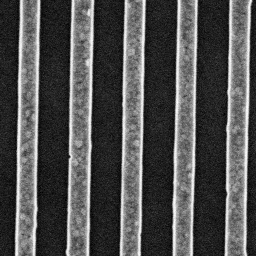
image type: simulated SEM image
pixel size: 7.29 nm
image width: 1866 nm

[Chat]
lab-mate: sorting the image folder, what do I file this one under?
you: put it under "parallel lines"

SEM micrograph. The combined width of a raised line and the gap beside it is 382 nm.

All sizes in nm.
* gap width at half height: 241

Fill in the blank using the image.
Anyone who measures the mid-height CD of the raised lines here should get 140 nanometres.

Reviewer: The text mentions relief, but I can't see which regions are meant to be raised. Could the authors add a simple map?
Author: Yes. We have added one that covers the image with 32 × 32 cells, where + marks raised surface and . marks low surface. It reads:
...++....+++....++....+++....++.
...++....+++....++....+++....++.
...++....+++....++....+++....++.
...++....+++....++....+++....++.
...++....+++....++....+++....++.
...++....++.....++....++.....++.
..+++....++.....++....++.....++.
..+++....++.....++....++.....++.
..+++....++.....++....++.....++.
..+++....++.....++....++.....++.
..+++....++.....++....++.....++.
..+++....++.....++....++.....++.
..+++....++....+++....++.....++.
..+++....++....+++....++.....++.
..+++....++....+++....++.....++.
..+++....++....+++....++....+++.
..+++....++....+++....++....+++.
..++.....++.....++....++.....++.
..+++....++....+++....++....+++.
..+++....++....+++....++....+++.
..+++....++....+++....++....+++.
..++.....++....+++....++....+++.
..++.....++....+++....++....+++.
..++.....++....+++....++....+++.
..++.....++....+++....++....+++.
..+++....++....+++....++....+++.
..+++....++....+++....++....+++.
..++.....++....+++....++....+++.
..++.....++....++.....++....+++.
..++.....++....++.....++....+++.
..++.....++....++.....++....+++.
..++....+++....++.....++....+++.